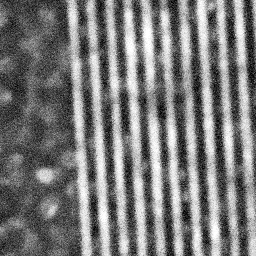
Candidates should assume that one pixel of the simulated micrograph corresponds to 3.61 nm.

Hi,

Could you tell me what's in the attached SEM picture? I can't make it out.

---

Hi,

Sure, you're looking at parallel lines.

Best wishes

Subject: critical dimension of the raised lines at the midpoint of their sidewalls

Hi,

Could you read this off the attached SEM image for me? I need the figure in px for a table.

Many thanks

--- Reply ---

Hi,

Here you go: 6.23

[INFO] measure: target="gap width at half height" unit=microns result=0.045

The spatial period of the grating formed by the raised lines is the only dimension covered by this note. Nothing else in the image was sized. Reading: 66.5 nanometers